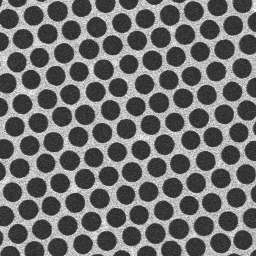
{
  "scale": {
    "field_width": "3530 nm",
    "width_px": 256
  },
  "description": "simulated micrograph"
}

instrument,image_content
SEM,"a regular array of holes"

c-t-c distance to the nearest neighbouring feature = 324 nanometres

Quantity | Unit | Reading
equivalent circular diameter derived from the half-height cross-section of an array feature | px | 19.8